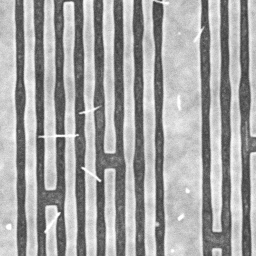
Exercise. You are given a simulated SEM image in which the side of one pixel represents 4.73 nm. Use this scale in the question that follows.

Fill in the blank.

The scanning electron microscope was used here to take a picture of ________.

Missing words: groups of lines, slits or small figures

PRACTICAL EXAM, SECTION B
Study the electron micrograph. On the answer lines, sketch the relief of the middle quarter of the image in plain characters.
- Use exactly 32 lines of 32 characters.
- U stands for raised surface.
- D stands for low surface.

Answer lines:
UUDDDUUDDDUUDDDUUDDDUUUDDUUUUUUU
UUDDDUUUDDUUDDDUUDDDUUDDDUUUUUUU
UUDDDUUUDDUUDDDUUDDDUUDDDUUUUUUU
UUUDDUUUDDUUDDDUUDDDUUDDDUUUUUUU
UUUDDUUUDDUUDDDUUDDDUUDDDUUUUUUU
UUUDDUUUDDUUDDDUUDDDUUDDDUUUUUUU
UUUDDUUDDDUUDDDUUDDDUUDDDUUUUUUU
UUUDDUUDDDUUDDDUUDDDUUDDDUUUUUUU
DUUDDUUDDDUUDDDUUDDDUUUDDUUUUUUU
DUUDDUUDDDUUDDDUUDDDUUUDDUUUUUUU
DUUDDUUDDDUUDDDUUDDDUUUDDUUUUUUU
DUUDDUUUDDUUDDDUUDDDUUUDDUUUUUUU
UUUDDUUDDDUUDDDUUDDDUUUDDUUUUUUU
UUUDDUUDDDUUDDDUUDDDUUUDDUUUUUUU
UUUDDUUDDDDUDDDUUDDDUUUDDUUUUUUU
UUUDDUUUDDUUDDDUUUDDUUUDDUUUUUUU
UUUDDUUUDDUUUDDUUUDDUUUDDUUUUUUU
UUUDDUUUDDUUUDDUUUDDUUUDDUUUUUUU
UUUDDUUUDDUUUDDUUUDDUUUDDUUUUUUU
DUUDDDUUDDUUUDDUUUDDUUUDDUUUUUUU
DUUDDDUUDDUUUDDUUUDDUUUDDUUUUUUU
UUUDDDUUDDUUUDDUUDDDUUUDDUUUUUUU
UUUDDUUUDDDDDDDUUDDDUUUDDUUUUUUU
UUUDDUUUDDDDDDDUUDDDUUUDDUUUUUUU
UUUDDUUUDDDDDDDUUDDDUUUDDUUUUUUU
DUUDDUUUDDDDDDDDUDDDUUUDDUUUUUUU
DUUDDUUUDDUUUDDDUDDDUUUDDUUUUUUU
DUUDDUUUDDUUUDDDUDDDUUUDDUUUUUUU
DUUDDUUUDDUUUDDUUDDDUUUDDUUUUUUU
DUUDDUUUDDUUUDDUUDDDUUUDDUUUUUUU
DUUDDDUUDDUUUDDUUDDDUUUDDUUUUUUU
DUUDDDUUDDUUUDDUUDDDUUUDDUUUUUUU